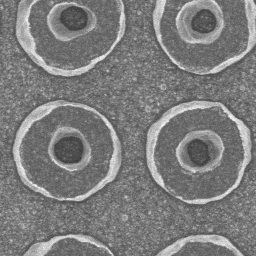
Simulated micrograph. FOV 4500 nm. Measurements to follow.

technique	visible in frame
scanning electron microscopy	ring-shaped raised bodies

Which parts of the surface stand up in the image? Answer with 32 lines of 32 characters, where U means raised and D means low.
DDDDUUUUUUUUUUUDDDDDUUUUUUUUUUUD
DDDUUUUDDDDUUUUDDDDDUUUUDDDUUUUU
DDDUUUUDDDDDUUUDDDDDUUUDDDDUUUUU
DDDUUUUDDDDUUUUDDDDUUUUDDDDUUUUU
DDDUUUUUUUUUUUUDDDDDUUUUDDUUUUUU
DDDUUUUUUUUUUUDDDDDDUUUUUUUUUUUD
DDDDUUUUUUUUUUDDDDDDDUUUUUUUUUUD
DDDDDUUUUUUUUDDDDDDDDUUUUUUUUDDD
DDDDDDUUUUUDDDDDDDDDDDDUUUUUDDDD
DDDDDDDDDDDDDDDDDDDDDDDDDDDDDDDD
DDDDDDDDDDDDDDDDDDDDDDDDDDDDDDDD
DDDDDDDDDDDDDDDDDDDDDDDDDDDDDDDD
DDDDDDDDDDDDDDDDDDDDDDDDDDDDDDDD
DDDDDDUUUUUDDDDDDDDDDDUUUUUUDDDD
DDDDUUUUUUUUUDDDDDDDDUUUUUUUUDDD
DDDUUUUUUUUUUUDDDDDDUUUUUUUUUUDD
DDDUUUUUUDUUUUDDDDDUUUUUUUUUUUUD
DDUUUUUDDDDUUUDDDDDUUUUUDDUUUUUD
DDUUUUDDDDDUUUUDDDDUUUUDDDDUUUUD
DDUUUUUDDDDUUUDDDDDUUUUDDDDUUUUD
DDUUUUUUDUUUUUDDDDDUUUUDDDDUUUUD
DDDUUUUUUUUUUUDDDDDUUUUUUUUUUUDD
DDDUUUUUUUUUUDDDDDDUUUUUUUUUUUDD
DDDDDUUUUUUUDDDDDDDDUUUUUUUUUDDD
DDDDDDUUUUUDDDDDDDDDDDUUUUUUDDDD
DDDDDDDDDDDDDDDDDDDDDDDDDDDDDDDD
DDDDDDDDDDDDDDDDDDDDDDDDDDDDDDDD
DDDDDDDDDDDDDDDDDDDDDDDDDDDDDDDD
DDDDDDDDDDDDDDDDDDDDDDDDDDDDDDDD
DDDDDDDDUDDDDDDDDDDDDDDDDDDDDDDD
DDDDDDUUUUUUDDDDDDDDDDUUUUUUUDDD
DDDDDUUUUUUUUUDDDDDDDUUUUUUUUUDD